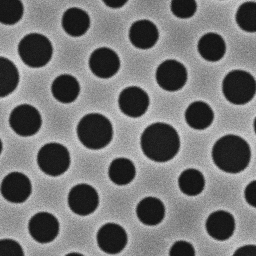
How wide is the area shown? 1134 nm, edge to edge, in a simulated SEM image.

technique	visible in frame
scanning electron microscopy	a regular array of holes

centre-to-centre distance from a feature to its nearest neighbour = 214 nanometres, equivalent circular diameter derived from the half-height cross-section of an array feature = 0.138 µm